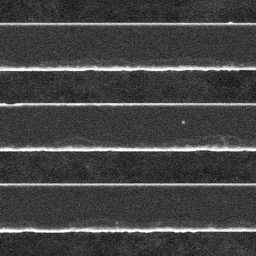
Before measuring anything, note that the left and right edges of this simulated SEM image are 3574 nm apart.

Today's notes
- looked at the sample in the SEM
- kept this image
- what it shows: lines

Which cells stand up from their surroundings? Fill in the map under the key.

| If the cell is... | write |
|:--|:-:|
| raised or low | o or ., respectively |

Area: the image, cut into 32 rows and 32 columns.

................................
................................
................................
oooooooooooooooooooooooooooooooo
oooooooooooooooooooooooooooooooo
oooooooooooooooooooooooooooooooo
oooooooooooooooooooooooooooooooo
oooooooooooooooooooooooooooooooo
oooooooooooooooooooooooooooooooo
................................
................................
................................
................................
oooooooooooooooooooooooooooooooo
oooooooooooooooooooooooooooooooo
oooooooooooooooooooooooooooooooo
oooooooooooooooooooooooooooooooo
oooooooooooooooooooooooooooooooo
oooooooooooooooooooooooooooooooo
................................
................................
................................
................................
oooooooooooooooooooooooooooooooo
oooooooooooooooooooooooooooooooo
oooooooooooooooooooooooooooooooo
oooooooooooooooooooooooooooooooo
oooooooooooooooooooooooooooooooo
oooooooooooooooooooooooooooooooo
................................
................................
................................